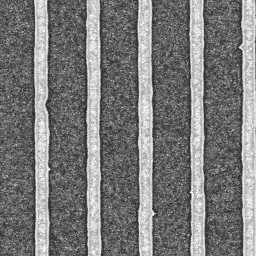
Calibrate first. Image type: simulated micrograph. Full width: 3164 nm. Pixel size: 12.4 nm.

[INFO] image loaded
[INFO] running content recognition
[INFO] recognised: parallel lines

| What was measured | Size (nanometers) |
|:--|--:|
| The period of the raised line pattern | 642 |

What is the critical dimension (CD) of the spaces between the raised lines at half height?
0.488 microns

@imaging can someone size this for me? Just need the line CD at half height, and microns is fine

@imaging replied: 0.153